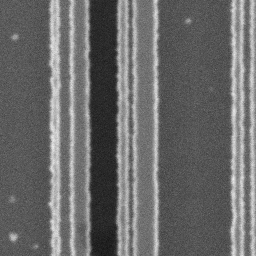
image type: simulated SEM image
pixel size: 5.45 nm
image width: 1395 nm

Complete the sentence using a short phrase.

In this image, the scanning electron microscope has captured lines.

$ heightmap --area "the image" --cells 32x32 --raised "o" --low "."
......ooooo....ooooo.........ooo
......ooooo....ooooo.........ooo
......ooooo....ooooo.........ooo
......ooooo....ooooo.........ooo
......ooooo....ooooo.........ooo
......ooooo....ooooo.........ooo
.......oooo....ooooo.........ooo
......ooooo....ooooo.........ooo
.......oooo....ooooo.........ooo
.......oooo....ooooo.........ooo
......ooooo....ooooo.........ooo
.......oooo....ooooo.........ooo
.......oooo....ooooo.........ooo
.......oooo....ooooo.........ooo
......ooooo....ooooo.........ooo
......ooooo....ooooo.........ooo
.......oooo....ooooo.........ooo
.......oooo....ooooo.........ooo
.......oooo....ooooo.........ooo
.......oooo....ooooo.........ooo
......ooooo....ooooo.........ooo
.......oooo....ooooo.........ooo
.......oooo....ooooo.........ooo
.......oooo....ooooo.........ooo
.......oooo....ooooo.........ooo
......ooooo....ooooo.........ooo
.......oooo....ooooo.........ooo
.......oooo....ooooo.........ooo
.......oooo....ooooo.........ooo
.......oooo....ooooo.........ooo
.......oooo....ooooo.........ooo
.......oooo....ooooo.........ooo